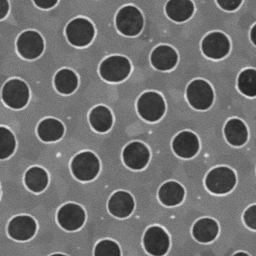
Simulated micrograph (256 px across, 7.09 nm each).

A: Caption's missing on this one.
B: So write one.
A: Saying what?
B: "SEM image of a regular array of holes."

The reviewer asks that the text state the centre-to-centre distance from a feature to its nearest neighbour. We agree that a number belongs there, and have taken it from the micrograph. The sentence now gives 356 nm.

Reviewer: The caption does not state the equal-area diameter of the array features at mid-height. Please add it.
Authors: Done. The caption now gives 199 nm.